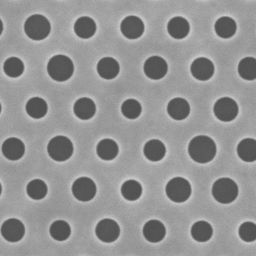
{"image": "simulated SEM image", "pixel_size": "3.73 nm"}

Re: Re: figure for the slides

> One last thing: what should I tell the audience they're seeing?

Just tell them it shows a regular array of holes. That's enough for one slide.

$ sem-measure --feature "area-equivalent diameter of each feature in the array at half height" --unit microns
0.0878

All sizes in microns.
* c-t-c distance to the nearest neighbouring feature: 0.174